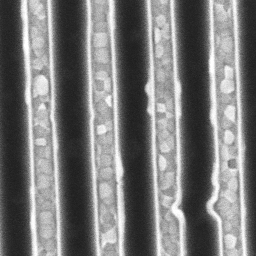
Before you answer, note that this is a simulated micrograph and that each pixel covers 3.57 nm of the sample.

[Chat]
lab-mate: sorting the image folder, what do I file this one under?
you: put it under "one or a few lines or trenches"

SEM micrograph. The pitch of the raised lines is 219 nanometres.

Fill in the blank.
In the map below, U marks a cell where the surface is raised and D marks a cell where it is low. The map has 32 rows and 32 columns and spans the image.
UUUDDDUUUUUDDDUUUUUDDUUUUUDDDUUU
UUUDDDUUUUUDDDUUUUUDDUUUUUDDDUUU
UUUDDDUUUUUDDDUUUUUDDUUUUUUDDUUU
UUUDDDUUUUUDDDUUUUUDDDUUUUUDDUUU
UUUDDDUUUUUDDDUUUUUDDDUUUUUDDUUU
UUUDDDUUUUUDDDUUUUUDDDUUUUUDDDUU
UUUUDDUUUUUDDDUUUUUDDDUUUUUDDDUU
UUUUDDUUUUUDDDUUUUUDDDUUUUUDDDUU
UUUUDDUUUUUDDDUUUUUDDDUUUUUDDDUU
UUUUDDUUUUUDDDUUUUUDDDUUUUUDDDUU
UUUUDDUUUUUDDDUUUUUDDDUUUUUDDDUU
UUUUDDUUUUUDDDUUUUUDDDUUUUUDDDUU
UUUUDDDUUUUDDDUUUUUDDDUUUUUDDDUU
UUUUDDUUUUUDDDUUUUUDDDUUUUUDDDUU
UUUUDDUUUUUUDDUUUUUDDDUUUUUDDDUU
UUUUDDDUUUUDDDUUUUUDDDUUUUUDDDUU
UUUUDDDUUUUDDDUUUUUDDDUUUUUDDDUU
UUUUDDDUUUUUDDDUUUUDDDUUUUUDDDUU
UUUUDDDUUUUUDDDUUUUDDDUUUUUDDDUU
UUUUDDDUUUUUDDDUUUUDDDUUUUUDDDUU
UUUUDDDUUUUUDDDUUUUDDDUUUUUDDDUU
UUUUDDDUUUUUDDDUUUUDDDUUUUUDDDUU
UUUUDDDUUUUUDDDUUUUUDDUUUUUDDDUU
UUUUDDDUUUUUDDDUUUUUDDUUUUUDDDUU
UUUUDDDUUUUUDDDUUUUUDDUUUUUDDDUU
UUUUDDDUUUUUDDDUUUUUDDUUUUUDDDUU
UUUUDDDUUUUUDDDUUUUUDDUUUUUDDDUU
UUUUDDDUUUUUDDDUUUUUDDUUUUUUDDUU
UUUUDDDUUUUUDDDUUUUUDDDUUUUUDDUU
UUUUDDDUUUUUDDDUUUUUDDDUUUUUDDUU
UUUUDDDUUUUUDDDUUUUUDDDUUUUUDDUU
UUUUUDDUUUUUDDDUUUUUDDDUUUUUDDDU